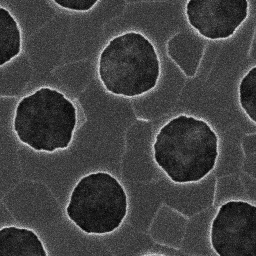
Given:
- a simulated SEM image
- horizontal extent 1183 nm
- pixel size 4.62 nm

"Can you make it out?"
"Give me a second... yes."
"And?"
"holes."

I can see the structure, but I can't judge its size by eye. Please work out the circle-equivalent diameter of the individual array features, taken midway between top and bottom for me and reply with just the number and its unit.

287 nanometers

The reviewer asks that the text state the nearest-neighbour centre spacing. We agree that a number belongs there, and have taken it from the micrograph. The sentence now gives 0.46 um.